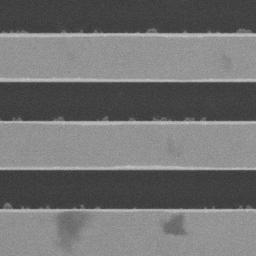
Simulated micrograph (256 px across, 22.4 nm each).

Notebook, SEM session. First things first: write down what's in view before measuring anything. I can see lines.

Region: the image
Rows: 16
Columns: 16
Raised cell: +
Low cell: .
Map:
................
................
++++++++++++++++
++++++++++++++++
++++++++++++++++
................
................
................
++++++++++++++++
++++++++++++++++
++++++++++++++++
................
................
++++++++++++++++
++++++++++++++++
++++++++++++++++